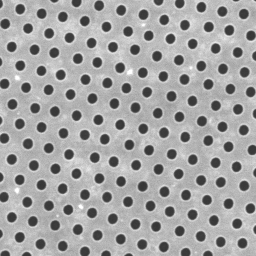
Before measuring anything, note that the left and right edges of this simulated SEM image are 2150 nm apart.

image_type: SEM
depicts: a regular array of holes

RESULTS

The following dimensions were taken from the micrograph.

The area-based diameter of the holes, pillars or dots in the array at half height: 86.4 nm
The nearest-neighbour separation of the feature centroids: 171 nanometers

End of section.